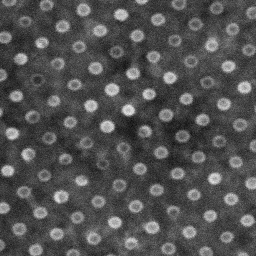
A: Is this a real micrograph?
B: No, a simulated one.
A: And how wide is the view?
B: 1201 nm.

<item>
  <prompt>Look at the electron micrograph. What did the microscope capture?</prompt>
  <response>a regular array of raised bodies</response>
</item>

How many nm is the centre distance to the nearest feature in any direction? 124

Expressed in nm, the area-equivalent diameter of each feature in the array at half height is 52.1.